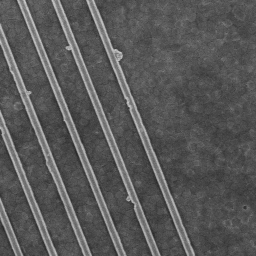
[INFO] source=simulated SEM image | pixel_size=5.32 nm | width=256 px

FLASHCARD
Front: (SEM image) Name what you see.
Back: parallel lines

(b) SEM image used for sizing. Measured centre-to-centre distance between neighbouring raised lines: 170 nm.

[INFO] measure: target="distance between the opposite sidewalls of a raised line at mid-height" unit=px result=5.58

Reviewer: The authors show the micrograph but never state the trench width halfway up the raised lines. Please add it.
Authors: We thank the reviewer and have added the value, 138 nm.